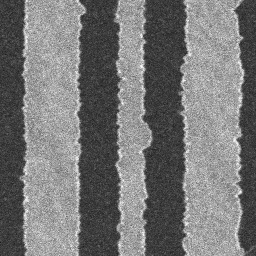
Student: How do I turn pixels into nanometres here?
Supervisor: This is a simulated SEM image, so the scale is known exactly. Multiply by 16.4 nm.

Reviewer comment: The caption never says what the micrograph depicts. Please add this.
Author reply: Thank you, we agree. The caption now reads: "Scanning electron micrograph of one or a few lines or trenches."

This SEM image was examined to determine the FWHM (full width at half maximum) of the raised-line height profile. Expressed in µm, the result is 0.669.